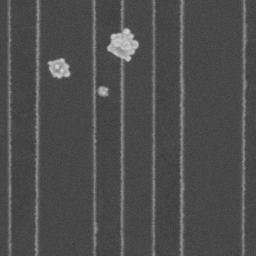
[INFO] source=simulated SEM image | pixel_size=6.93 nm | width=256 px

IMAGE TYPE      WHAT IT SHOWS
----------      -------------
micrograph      lines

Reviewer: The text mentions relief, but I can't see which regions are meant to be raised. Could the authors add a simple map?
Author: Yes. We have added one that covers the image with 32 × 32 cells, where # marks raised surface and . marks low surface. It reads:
#....#######...####....########.
#....#######...####....########.
#....#######...####....########.
#....#######...####....########.
#....#######..#####....########.
#....#######..#####....########.
#....#######..#####....########.
#....#######...####....########.
#....#######...####....########.
#....#######...####....########.
#....#######...####....########.
#....#######...####....########.
#....#######...####....########.
#...########...####....########.
#....#######...####....########.
#....#######...####....########.
#....#######...####....########.
#....#######...####....########.
#....#######...####....########.
#....#######...####....########.
#...########...####....########.
#....#######...####....########.
#...########...####....########.
#...########...####....########.
#....#######...####....########.
#...########...####....#######..
#...########...####....########.
#...########...####....########.
#....#######...####....#######..
#...########...####....########.
#...########...####....########.
#...########...####....#######..